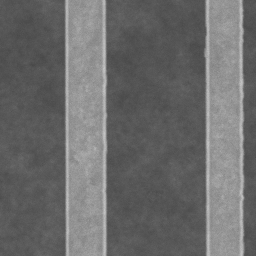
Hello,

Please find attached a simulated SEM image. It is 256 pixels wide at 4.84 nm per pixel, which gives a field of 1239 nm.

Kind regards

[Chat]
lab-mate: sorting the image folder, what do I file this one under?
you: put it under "one or a few lines or trenches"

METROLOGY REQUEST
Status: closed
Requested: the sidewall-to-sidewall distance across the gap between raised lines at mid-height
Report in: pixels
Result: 103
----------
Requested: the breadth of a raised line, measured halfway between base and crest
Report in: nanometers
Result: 174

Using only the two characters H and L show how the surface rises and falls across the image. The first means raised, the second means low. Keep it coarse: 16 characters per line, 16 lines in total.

LLLLHHLLLLLLLHHL
LLLLHHLLLLLLLHHL
LLLLHHLLLLLLLHHL
LLLLHHLLLLLLLHHL
LLLLHHHLLLLLLHHL
LLLLHHHLLLLLLHHL
LLLLHHLLLLLLLHHL
LLLLHHHLLLLLLHHL
LLLLHHLLLLLLLHHL
LLLLHHHLLLLLLHHL
LLLLHHHLLLLLLHHL
LLLLHHHLLLLLLHHL
LLLLHHHLLLLLLHHL
LLLLHHHLLLLLLHHL
LLLLHHHLLLLLLHHL
LLLLHHHLLLLLLHHL